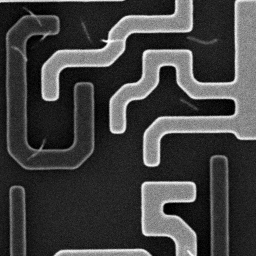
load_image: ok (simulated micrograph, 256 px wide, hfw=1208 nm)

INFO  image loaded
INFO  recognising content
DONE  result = wiring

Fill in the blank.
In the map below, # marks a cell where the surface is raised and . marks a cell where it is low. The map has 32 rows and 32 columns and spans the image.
......................##.....###
......................##.....###
..#####........#########.....###
.######.......##########.....###
.###..........##.............###
.##..........###.............###
.##....########...######.....###
.##...########....######.....###
.##..###..........##..##.....###
.##..##...........##..##.....###
.##..##...#.....####..##########
.##..##..###...####....#########
.##...#..###..###............###
.##......###..##.............###
.##......###..##............####
.##......###..##...#############
.##......###..#...####.......###
.##......###......##............
.###.....###......##............
.##########.......##.......#....
..########........##......##....
..........................##....
..........................##....
..#...............######..##....
.##...............######..##....
.##...............###.....##....
.##...............###.....##....
.##...............#####...##....
.##...............######..##....
.##..................###..###...
.##...................##..###...
.##....###########....##..###...